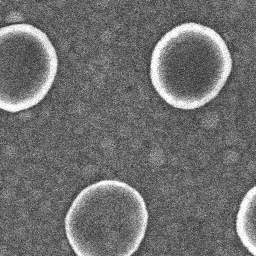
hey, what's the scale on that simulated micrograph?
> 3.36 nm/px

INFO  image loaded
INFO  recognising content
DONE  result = raised bodies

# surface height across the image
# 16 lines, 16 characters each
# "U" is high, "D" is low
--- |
DDDDDDDDDDDDDDDD
DDDDDDDDDDDDDDDD
UUUDDDDDDDUUUUDD
UUUDDDDDDDUUUUDD
UUUDDDDDDDUUUUDD
UUUDDDDDDDUUUUDD
UUDDDDDDDDDUDDDD
DDDDDDDDDDDDDDDD
DDDDDDDDDDDDDDDD
DDDDDDDDDDDDDDDD
DDDDDDDDDDDDDDDD
DDDDDDDDDDDDDDDD
DDDDDDDDDDDDDDDU
DDDDDDDDDDDDDDDU
DDDDDDDDDDDDDDDU
DDDDDDDDDDDDDDDD